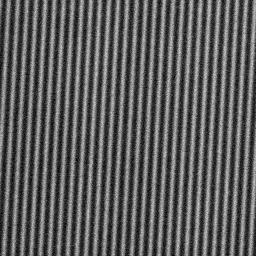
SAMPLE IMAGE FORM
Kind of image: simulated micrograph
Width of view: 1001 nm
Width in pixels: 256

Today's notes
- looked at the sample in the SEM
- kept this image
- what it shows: parallel lines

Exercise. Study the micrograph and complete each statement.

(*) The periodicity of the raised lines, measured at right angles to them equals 0.0356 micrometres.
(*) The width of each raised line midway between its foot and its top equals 8.8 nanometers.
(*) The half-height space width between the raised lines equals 26.3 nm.